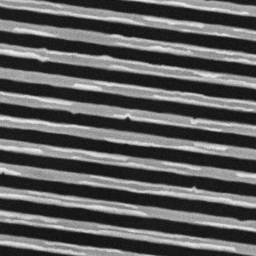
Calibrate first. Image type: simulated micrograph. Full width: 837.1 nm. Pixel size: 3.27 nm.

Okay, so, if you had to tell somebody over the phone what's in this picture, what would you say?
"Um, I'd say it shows parallel lines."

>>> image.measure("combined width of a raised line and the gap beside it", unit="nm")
77.3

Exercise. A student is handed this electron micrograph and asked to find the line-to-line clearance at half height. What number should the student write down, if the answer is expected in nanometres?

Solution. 43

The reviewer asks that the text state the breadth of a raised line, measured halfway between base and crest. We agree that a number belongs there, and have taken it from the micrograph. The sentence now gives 34.4 nanometers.